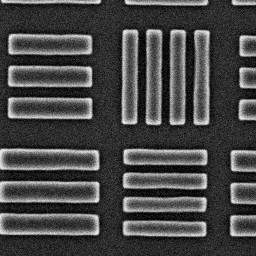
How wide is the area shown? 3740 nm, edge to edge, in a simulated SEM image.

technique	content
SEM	groups of lines, slits or small figures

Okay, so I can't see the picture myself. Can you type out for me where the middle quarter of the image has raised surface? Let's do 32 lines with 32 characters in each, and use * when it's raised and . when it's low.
...............***...***...***..
*******........***...***...***..
*******........***...***...***..
*******........***...***...***..
*******........***...***...***..
...............***...***...***..
...............***...***...***..
...............***...***...***..
...............***...***...***..
*******........***...***...***..
*******........***...***...***..
*******........***...***...***..
*******........***...***...***..
...............***...***...***..
...............***...***...***..
................................
................................
................................
................................
................................
................................
................****............
*********......*****************
*********......*****************
*********......*****************
*********.......................
................................
...............*****************
...............*****************
...............*****************
*********......*****************
*********.......................